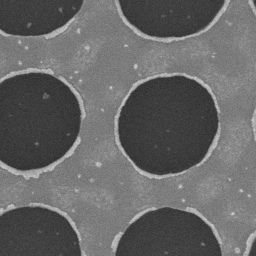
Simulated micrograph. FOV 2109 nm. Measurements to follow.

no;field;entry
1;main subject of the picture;holes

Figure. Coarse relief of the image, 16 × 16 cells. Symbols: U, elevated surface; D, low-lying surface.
DDDDDUUUDDDDDDUU
DDDDUUUUDDDDDUUU
UUUUUUUUUUUUUUUU
UUUUUUUUUUUUUUUU
UUUUUUUUUUUUUUUU
DDDDUUUUUDDDDUUU
DDDDDUUUDDDDDUUU
DDDDDUUDDDDDDDUU
DDDDDUUDDDDDDUUU
DDDDUUUUDDDDDUUU
UDUUUUUUUDDDUUUU
UUUUUUUUUUUUUUUU
UUUUUUUUUUUUUUUU
DDDDUUUUUDDDUUUU
DDDDDUUUDDDDDUUU
DDDDDUUDDDDDDDUU